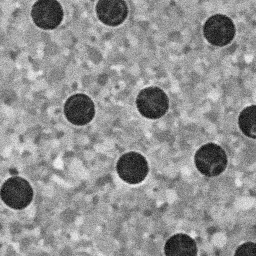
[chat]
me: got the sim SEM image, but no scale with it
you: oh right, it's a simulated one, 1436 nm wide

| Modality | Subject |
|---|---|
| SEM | holes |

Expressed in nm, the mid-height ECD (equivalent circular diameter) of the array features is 195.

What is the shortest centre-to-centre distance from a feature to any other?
412 nm